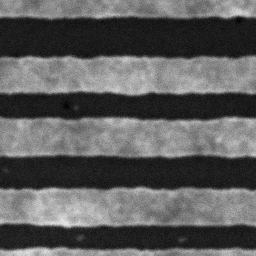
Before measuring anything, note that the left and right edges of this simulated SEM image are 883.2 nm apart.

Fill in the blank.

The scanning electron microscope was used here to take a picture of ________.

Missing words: lines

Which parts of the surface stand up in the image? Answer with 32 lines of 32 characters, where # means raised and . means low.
################################
################################
................................
................................
................................
................................
................................
##########.############.########
################################
################################
################################
########....#.##############..##
................................
................................
................................
################################
################################
################################
################################
............................#...
................................
................................
................................
................................
################################
################################
################################
################################
................................
................................
................................
################################